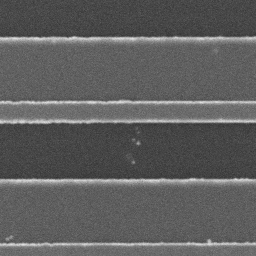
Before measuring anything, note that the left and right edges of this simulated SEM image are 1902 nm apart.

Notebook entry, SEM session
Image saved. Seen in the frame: lines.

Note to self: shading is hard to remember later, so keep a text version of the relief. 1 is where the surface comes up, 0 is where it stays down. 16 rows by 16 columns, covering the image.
0000000000000000
0000000000000000
1111111111111111
1111111111111111
1111111111111111
1111111111111111
1111111111111111
1111111111111111
0000000000000000
0000000000000000
0000000000000000
1111111111111111
1111111111111111
1111111111111111
1111111111111111
1111111111111111